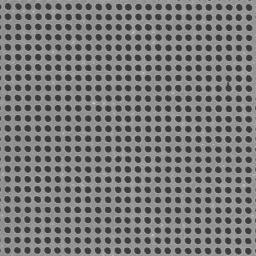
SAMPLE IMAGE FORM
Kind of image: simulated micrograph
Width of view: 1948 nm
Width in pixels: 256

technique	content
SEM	a regular array of holes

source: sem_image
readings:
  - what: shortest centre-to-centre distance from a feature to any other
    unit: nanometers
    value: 75.5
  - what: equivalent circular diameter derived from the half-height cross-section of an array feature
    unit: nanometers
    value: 52.3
